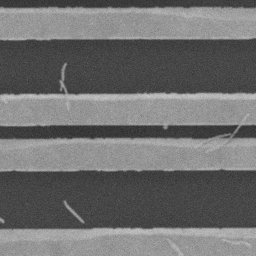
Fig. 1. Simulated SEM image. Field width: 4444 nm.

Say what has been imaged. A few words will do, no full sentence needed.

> lines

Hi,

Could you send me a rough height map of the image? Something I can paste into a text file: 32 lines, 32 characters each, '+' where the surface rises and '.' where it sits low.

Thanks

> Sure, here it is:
................................
++++++++++++++++++++++..........
++++++++++++++++++++++++++++++++
++++++++++++++++++++++++++++++++
++++++++++++++++++++++++++++++++
................................
................................
................................
................................
................................
................................
................................
++++++++++++++++++++++++++++++++
++++++++++++++++++++++++++++++++
++++++++++++++++++++++++++++++++
++++++++++++++++++++++++++++++++
................................
................................
++++++++++++++++++++++++++++++++
++++++++++++++++++++++++++++++++
++++++++++++++++++++++++++++++++
................................
................................
................................
................................
................................
................................
................................
................................
.+++++++++++++++++++++++++++++++
++++++++++++++++++++++++++++++++
++++++++++++++++++++++++++++++++